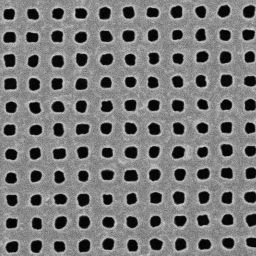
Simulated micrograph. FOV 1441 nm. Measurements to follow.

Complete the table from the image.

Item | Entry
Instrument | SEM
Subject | a regular array of holes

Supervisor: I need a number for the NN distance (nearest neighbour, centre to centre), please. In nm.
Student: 129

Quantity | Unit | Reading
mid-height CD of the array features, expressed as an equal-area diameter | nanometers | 67